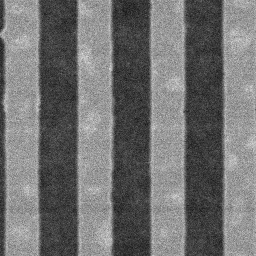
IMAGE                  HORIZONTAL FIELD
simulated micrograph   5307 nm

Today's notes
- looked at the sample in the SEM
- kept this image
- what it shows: one or a few lines or trenches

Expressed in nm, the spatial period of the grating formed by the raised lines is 1510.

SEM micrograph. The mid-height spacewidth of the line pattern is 801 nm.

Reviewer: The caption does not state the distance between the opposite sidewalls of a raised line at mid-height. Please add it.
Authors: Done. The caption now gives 710 nm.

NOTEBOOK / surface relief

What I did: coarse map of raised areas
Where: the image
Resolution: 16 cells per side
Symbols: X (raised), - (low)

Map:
XX---XX--XXX--XX
XX---XX--XXX--XX
XX---XX--XXX--XX
XX---XX--XXX--XX
XX---XX--XXX--XX
XX---XX--XXX--XX
XX---XX--XXX--XX
XX---XX--XXX--XX
XX---XX--XXX--XX
XX---XX--XXX--XX
XX---XX--XXX--XX
XX---XX--XXX--XX
XX---XX--XXX--XX
XX---XX--XXX--XX
XX---XX--XXX--XX
XX---XX--XXX--XX